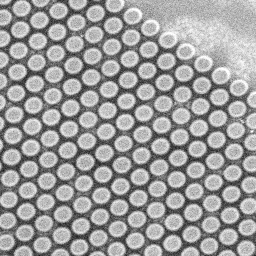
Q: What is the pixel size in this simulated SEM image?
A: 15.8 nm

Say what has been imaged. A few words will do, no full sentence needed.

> a regular array of raised bodies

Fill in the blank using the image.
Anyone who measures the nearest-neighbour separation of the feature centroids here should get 0.334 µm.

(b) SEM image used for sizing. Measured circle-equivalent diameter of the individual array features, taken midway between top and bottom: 246 nm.